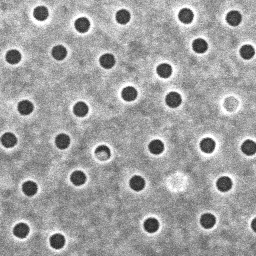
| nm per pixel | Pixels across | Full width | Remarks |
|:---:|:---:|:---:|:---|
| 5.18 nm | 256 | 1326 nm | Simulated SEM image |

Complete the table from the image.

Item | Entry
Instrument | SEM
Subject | a regular array of holes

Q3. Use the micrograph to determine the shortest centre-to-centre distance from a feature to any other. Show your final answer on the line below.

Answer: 0.203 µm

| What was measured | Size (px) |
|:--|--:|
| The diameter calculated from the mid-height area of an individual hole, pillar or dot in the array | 17.3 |